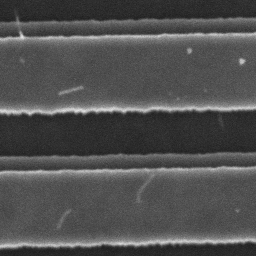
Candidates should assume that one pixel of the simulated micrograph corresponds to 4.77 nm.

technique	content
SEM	lines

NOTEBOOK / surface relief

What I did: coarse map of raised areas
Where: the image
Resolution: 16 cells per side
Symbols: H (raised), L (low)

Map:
LLLLLLLLLLLLLLLL
LLLLLLLLLLLLLLLL
HHHHHHHHHHHHHHHH
HHHHHHHHHHHHHHHH
HHHHHHHHHHHHHHHH
HHHHHHHHHHHHHHHH
HHHHHHHHHHHHHHHH
LLLLLLLLLLLLLLLL
LLLLLLLLLLLLLLLL
LLLLLLLLLLLLLLLL
LLLLLLLLLLLLLHHH
HHHHHHHHHHHHHHHH
HHHHHHHHHHHHHHHH
HHHHHHHHHHHHHHHH
HHHHHHHHHHHHHHHH
LLLLLLLLLLLLLLLL